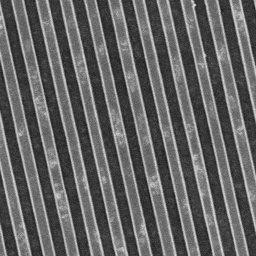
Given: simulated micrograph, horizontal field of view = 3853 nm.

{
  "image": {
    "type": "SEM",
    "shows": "parallel lines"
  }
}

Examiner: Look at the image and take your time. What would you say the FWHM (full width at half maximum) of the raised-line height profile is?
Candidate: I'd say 0.169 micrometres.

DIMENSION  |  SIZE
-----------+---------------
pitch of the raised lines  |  23.6 px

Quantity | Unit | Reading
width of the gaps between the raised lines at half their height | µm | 0.182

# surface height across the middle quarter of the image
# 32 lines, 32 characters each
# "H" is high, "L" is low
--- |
LLLHHHLLLHHHLLLHHHLLLHHHLLLHHHLL
LLLHHHLLLHHHLLLHHHLLLHHHLLLHHHLL
LLLHHHLLLHHHLLLHHHLLLHHHLLLHHHLL
LLLHHHLLLLHHLLLHHHLLLLHHLLLLHHLL
LLLLHHLLLLHHLLLLHHHLLLHHHLLLHHHL
LLLLHHHLLLHHHLLLHHHLLLHHHLLLHHHL
HLLLHHHLLLHHHLLLHHHLLLHHHLLLHHHL
HLLLHHHLLLHHHLLLHHHLLLHHHLLLHHHL
HLLLHHHLLLHHHLLLHHHLLLLHHLLLLHHL
HHLLLHHLLLLHHLLLLHHHLLLHHHLLLHHH
HHLLLHHLLLLHHHLLLHHHLLLHHHLLLHHH
HHLLLHHHLLLHHHLLLHHHLLLHHHLLLHHH
HHLLLHHHLLLHHHLLLHHHLLLLHHLLLHHH
HHLLLLHHLLLLHHLLLLHHHLLLHHHLLLHH
HHHLLLHHHLLLHHHLLLHHHLLLHHHLLLHH
HHHLLLHHHLLLHHHLLLHHHLLLHHHLLLHH
HHHLLLHHHLLLHHHLLLHHHLLLHHHLLLHH
HHHLLLHHHLLLHHHLLLHHHLLLLHHLLLLH
LHHLLLLHHLLLLHHLLLLHHHLLLHHHLLLH
LHHHLLLHHHLLLHHHLLLHHHLLLHHHLLLH
LHHHLLLHHHLLLHHHLLLHHHLLLHHHLLLH
LHHHLLLHHHLLLHHHLLLHHHLLLHHHLLLL
LLHHLLLLHHLLLLHHLLLLHHHLLLHHLLLL
LLHHLLLLHHHLLLHHHLLLHHHLLLHHHLLL
LLHHHLLLHHHLLLHHHLLLHHHLLLHHHLLL
LLHHHLLLHHHLLLHHHLLLHHHLLLHHHLLL
LLHHHLLLHHHLLLHHHLLLHHHLLLLHHLLL
LLLHHLLLLHHLLLLHHLLLLHHHLLLHHHLL
LLLHHLLLLHHHLLLHHHLLLHHHLLLHHHLL
LLLHHHLLLHHHLLLHHHLLLHHHLLLHHHLL
LLLHHHLLLHHHLLLHHHLLLHHHLLLHHHLL
LLLHHHLLLLHHLLLHHHLLLHHHLLLLHHLL